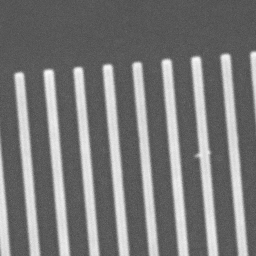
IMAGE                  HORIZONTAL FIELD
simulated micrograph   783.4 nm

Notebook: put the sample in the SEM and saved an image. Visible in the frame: parallel lines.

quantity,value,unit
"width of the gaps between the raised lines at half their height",64.3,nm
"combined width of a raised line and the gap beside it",90.5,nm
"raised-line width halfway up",24.4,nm